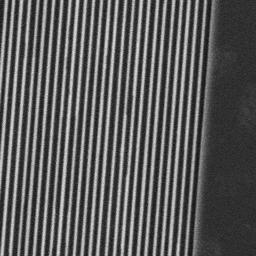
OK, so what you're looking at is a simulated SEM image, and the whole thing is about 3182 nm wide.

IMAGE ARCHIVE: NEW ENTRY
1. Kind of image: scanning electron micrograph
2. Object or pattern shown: parallel lines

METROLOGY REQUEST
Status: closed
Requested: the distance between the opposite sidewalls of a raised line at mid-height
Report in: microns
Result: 0.0248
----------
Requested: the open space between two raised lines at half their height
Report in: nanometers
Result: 74.4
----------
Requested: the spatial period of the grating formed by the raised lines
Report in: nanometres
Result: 99